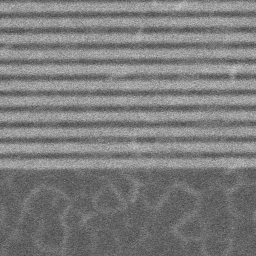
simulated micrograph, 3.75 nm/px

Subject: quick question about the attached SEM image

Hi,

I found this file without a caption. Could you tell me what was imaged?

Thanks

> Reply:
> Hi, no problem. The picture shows parallel lines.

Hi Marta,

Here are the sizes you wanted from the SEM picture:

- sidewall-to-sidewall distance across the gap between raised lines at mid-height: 36.6 nm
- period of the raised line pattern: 0.0588 um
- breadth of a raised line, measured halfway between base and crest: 23 nanometres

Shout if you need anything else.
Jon